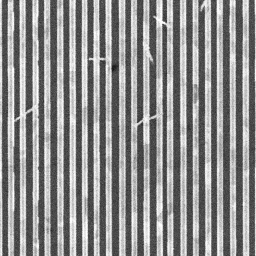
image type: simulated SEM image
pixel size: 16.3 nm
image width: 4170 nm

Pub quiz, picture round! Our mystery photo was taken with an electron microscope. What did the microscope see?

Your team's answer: parallel lines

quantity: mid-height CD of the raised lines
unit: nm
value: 69.2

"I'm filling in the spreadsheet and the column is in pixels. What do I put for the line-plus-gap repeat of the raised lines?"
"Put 12.4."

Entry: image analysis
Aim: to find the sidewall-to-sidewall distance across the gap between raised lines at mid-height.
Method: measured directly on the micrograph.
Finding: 136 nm